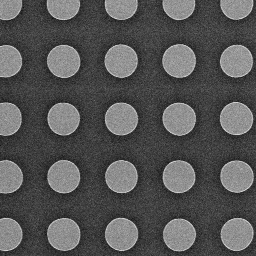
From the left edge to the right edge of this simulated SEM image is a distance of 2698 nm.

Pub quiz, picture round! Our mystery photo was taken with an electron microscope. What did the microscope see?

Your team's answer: an array of small figures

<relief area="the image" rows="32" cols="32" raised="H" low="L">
HHHLLLHHHHLLLHHHHLLLHHHHLLLLHHHH
HHLLLLHHHHLLLHHHHLLLLHHHLLLLHHHL
LLLLLLLLLLLLLLLLLLLLLLLLLLLLLLLL
LLLLLLLLLLLLLLLLLLLLLLLLLLLLLLLL
LLLLLLLLLLLLLLLLLLLLLLLLLLLLLLLL
LLLLLLLLLLLLLLLLLLLLLLLLLLLLLLLL
HHLLLLHHHHLLLHHHHLLLLHHHLLLLHHHL
HHHLLLHHHHLLLHHHHLLLHHHHLLLLHHHL
HHHLLLHHHHLLLHHHHLLLLHHHLLLLHHHL
HLLLLLLHHLLLLLHHLLLLLLHLLLLLLHLL
LLLLLLLLLLLLLLLLLLLLLLLLLLLLLLLL
LLLLLLLLLLLLLLLLLLLLLLLLLLLLLLLL
LLLLLLLLLLLLLLLLLLLLLLLLLLLLLLLL
HHLLLLHHHLLLLLHHHLLLLHHHLLLLHHHL
HHHLLLHHHHLLLHHHHLLLHHHHLLLLHHHH
HHHLLLHHHHLLLHHHHLLLHHHHLLLLHHHH
HHLLLLLHHLLLLLHHLLLLLHHHLLLLHHHL
LLLLLLLLLLLLLLLLLLLLLLLLLLLLLLLL
LLLLLLLLLLLLLLLLLLLLLLLLLLLLLLLL
LLLLLLLLLLLLLLLLLLLLLLLLLLLLLLLL
HHLLLLLHHLLLLLHHLLLLLHHHLLLLHHHL
HHHLLLHHHHLLLHHHHLLLHHHHLLLLHHHH
HHHLLLHHHHLLLHHHHLLLHHHHLLLLHHHH
HHLLLLLHHLLLLLHHHLLLLHHHLLLLHHHL
LLLLLLLLLLLLLLLLLLLLLLLLLLLLLLLL
LLLLLLLLLLLLLLLLLLLLLLLLLLLLLLLL
LLLLLLLLLLLLLLLLLLLLLLLLLLLLLLLL
HHLLLLLHHLLLLLHHLLLLLLHLLLLLLHHL
HHHLLLHHHHLLLHHHHLLLLHHHLLLLHHHH
HHHLLLHHHHLLLHHHHLLLHHHHLLLLHHHH
HHLLLLHHHHLLLLHHHLLLLHHHLLLLHHHL
LLLLLLLLLLLLLLLLLLLLLLLLLLLLLLLL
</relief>